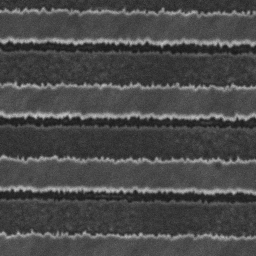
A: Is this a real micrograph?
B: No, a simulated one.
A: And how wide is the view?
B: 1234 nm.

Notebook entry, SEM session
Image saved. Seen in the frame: lines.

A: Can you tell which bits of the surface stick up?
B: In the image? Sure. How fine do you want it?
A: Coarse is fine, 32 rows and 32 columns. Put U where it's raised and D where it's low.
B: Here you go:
DDDDDDDDDDDDDDDDDDDDDDDDDDDDDDDD
UUUUUUUUUUDUUUUUUUUDUDUDDDDDDUDD
UUUUUUUUUUUUUUUUUUUUUUUUUUUUUUUU
UUUUUUUUUUUUUUUUUUUUUUUUUUUUUUUU
UUUUUUUUUUUUUUUUUUUUUUUUUUUUUUUU
DDDDDDDDDUDDDDDUUUDUUUUUUUUUUUUU
DDDDDDDDDDDDDDDDDDDDDDDDDDDDDDDD
DDDDDDDDDDDDDDDDDDDDDDDDDDDDDDDD
DDDDDDDDDDDDDDDDDDDDDDDDDDDDDDDD
DDDDDDDDDDDDDDDDDDDDDDDDDDDDDDDD
UUDDDDDUDDDDDUDDDDDDDDDDDDDDDDDD
UUUUUUUUUUUUUUUUUUUUUUUUUUUUUUUU
UUUUUUUUUUUUUUUUUUUUUUUUUUUUUUUU
UUUUUUUUUUUUUUUUUUUUUUUUUUUUUUUU
UUUUUUUUUUUUUUUUUUUUUUUUUUUUUUUU
DDDDDDDDDDDDDDDDDDDDDDDDDDDDDDDD
DDDDDDDDDDDDDDDDDDDDDDDDDDDDDDDD
DDDDDDDDDDDDDDDDDDDDDDDDDDDDDDDD
DDDDDDDDDDDDDDDDDDDDDDDDDDDDDDDD
DDDDDDDDDDDDDDDDDDDDDDDDDDDDDDDD
UUUUUUUUUUUUUUUUUUUUUUUUUUUUUUUU
UUUUUUUUUUUUUUUUUUUUUUUUUUUUUUUU
UUUUUUUUUUUUUUUUUUUUUUUUUUUUUUUU
UUUUUUUUUUUUUUUUUUUUUUUUUUUUUUUU
DDDDDDDDDDDDDDDDDDDDDDDDDDDDDDDD
DDDDDDDDDDDDDDDDDDDDDDDDDDDDDDDD
DDDDDDDDDDDDDDDDDDDDDDDDDDDDDDDD
DDDDDDDDDDDDDDDDDDDDDDDDDDDDDDDD
DDDDDDDDDDDDDDDDDDDDDDDDDDDDDDDD
UUUUUUUUUUUUUUUDUUUUUDUUUUUDDDDD
UUUUUUUUUUUUUUUUUUUUUUUUUUUUUUUU
UUUUUUUUUUUUUUUUUUUUUUUUUUUUUUUU